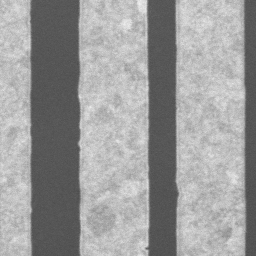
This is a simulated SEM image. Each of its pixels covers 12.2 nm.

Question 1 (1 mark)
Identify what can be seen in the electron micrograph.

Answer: one or a few lines or trenches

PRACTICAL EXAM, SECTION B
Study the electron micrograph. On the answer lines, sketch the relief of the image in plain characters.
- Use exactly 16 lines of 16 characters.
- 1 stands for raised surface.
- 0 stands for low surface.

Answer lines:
1100011110011110
1100011110011110
1100011110011110
1100011110011110
1100011110011110
1100011110011110
1100011110011110
1100011110011110
1100011110011110
1100011110011110
1100011110011110
1100011110011110
1100011110011110
1100011110011110
1100011110011110
1100011110011110